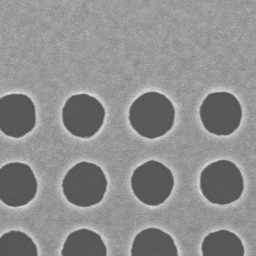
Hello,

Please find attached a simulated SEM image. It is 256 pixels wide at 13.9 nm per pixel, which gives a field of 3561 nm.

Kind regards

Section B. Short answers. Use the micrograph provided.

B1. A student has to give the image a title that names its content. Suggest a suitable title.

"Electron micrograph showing holes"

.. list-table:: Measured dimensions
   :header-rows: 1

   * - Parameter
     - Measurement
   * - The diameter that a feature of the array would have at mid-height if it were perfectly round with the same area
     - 618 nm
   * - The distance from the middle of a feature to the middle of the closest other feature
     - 951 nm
